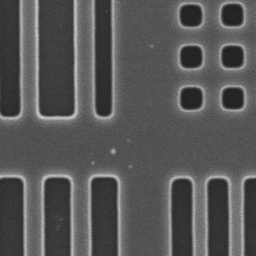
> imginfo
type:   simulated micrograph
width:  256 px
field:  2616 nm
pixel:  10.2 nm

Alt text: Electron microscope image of groups of lines, slits or small figures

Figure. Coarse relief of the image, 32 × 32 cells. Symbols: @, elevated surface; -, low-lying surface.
---@@----@@@--@@@@@@@@@@@@@@--@@
---@@----@@@--@@@@@@@@---@@@--@@
---@@----@@@--@@@@@@@@---@@@--@@
---@@----@@@--@@@@@@@@@@@@@@@@@@
---@@----@@@--@@@@@@@@@@@@@@@@@@
---@@----@@@--@@@@@@@@@@@@@@@@@@
---@@----@@@--@@@@@@@@@--@@@--@@
---@@-----@@--@@@@@@@@---@@@---@
---@@----@@@--@@@@@@@@@-@@@@@-@@
---@@----@@@--@@@@@@@@@@@@@@@@@@
---@@-----@@--@@@@@@@@@@@@@@@@@@
---@@-----@@--@@@@@@@@@--@@@--@@
---@@-----@@--@@@@@@@@---@@@---@
---@@-----@@--@@@@@@@@@--@@@--@@
--@@@----@@@--@@@@@@@@@@@@@@@@@@
@@@@@@@@@@@@@@@@@@@@@@@@@@@@@@@@
@@@@@@@@@@@@@@@@@@@@@@@@@@@@@@@@
@@@@@@@@@@@@@@@@@@@@@@@@@@@@@@@@
@@@@@@@@@@@@@@@@@@@@@@@@@@@@@@@@
@@@@@@@@@@@@@@@@@@@@@@@@@@@@@@@@
@@@@@@@@@@@@@@@@@@@@@@@@@@@@@@@@
@@@@@@@@@@@@@@@@@@@@@@@@@@@@@@@@
---@@@---@@----@@@@@@@--@@--@@@-
---@@----@@----@@@@@@---@@---@--
---@@----@@----@@@@@@---@@---@--
---@@----@@----@@@@@@---@@---@--
---@@----@@----@@@@@@---@@---@--
---@@----@@----@@@@@@---@@---@--
---@@----@@----@@@@@@---@@---@--
---@@----@@----@@@@@@---@@---@--
---@@----@@----@@@@@@---@@---@--
---@@----@@----@@@@@@---@@---@--